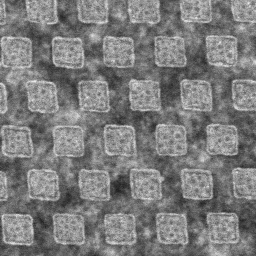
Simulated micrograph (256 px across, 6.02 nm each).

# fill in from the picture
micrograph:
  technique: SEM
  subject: a regular array of raised bodies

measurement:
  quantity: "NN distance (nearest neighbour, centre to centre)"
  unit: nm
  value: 305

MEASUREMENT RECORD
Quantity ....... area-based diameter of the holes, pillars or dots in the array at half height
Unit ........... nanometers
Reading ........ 197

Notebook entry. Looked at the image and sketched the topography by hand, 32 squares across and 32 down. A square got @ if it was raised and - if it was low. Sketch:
---@@@@---@@@---@@@@---@@@---@@@
@---@@@---@@@---@@@@---@@@---@@@
@---@@@---@@@----@@@---@@@----@@
--------------------------------
--------------------------------
@@@@---@@@---@@@@--@@@@---@@@@--
@@@@---@@@---@@@@--@@@@---@@@---
@@@@---@@@---@@@@--@@@@---@@@@--
--------------------------------
--------------------------------
----@@----@@@---@@@@---@@@---@@@
@--@@@@---@@@@--@@@@---@@@---@@@
@---@@@---@@@@--@@@@---@@@---@@@
@---@@@---@@@@---@@@---@@@----@@
--------------------------------
--------------------------------
@@@@---@@@---@@@@---@@@---@@@@--
@@@@---@@@---@@@@---@@@---@@@@--
@@@@---@@@---@@@@---@@@---@@@@--
-@@@----------------------------
--------------------------------
----@@@---@@@----@@@---@@@---@@@
@---@@@---@@@---@@@@---@@@---@@@
@---@@@---@@@@---@@@---@@@@--@@@
@---@@@---@@@@---@@@---@@@----@@
--------------------------------
--------------------------------
@@@@---@@@---@@@@---@@@---@@@@--
@@@@---@@@---@@@@---@@@---@@@@--
@@@@---@@@---@@@@---@@@---@@@@--
---------------@----------------
--------------------------------